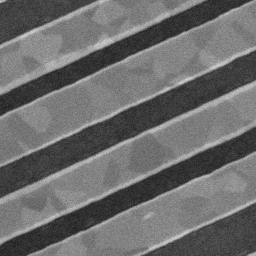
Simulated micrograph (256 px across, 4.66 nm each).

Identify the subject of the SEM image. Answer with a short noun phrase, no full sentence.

lines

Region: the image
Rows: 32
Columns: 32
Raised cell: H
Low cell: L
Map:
LLLLLLLLLLLHHHHHHHHHHHHHLLLLLLLH
LLLLLLLLLHHHHHHHHHHHHHLLLLLLHHHH
LLLLLLLHHHHHHHHHHHHHLLLLLLLHHHHH
LLLLLHHHHHHHHHHHHHLLLLLLHHHHHHHH
LLHHHHHHHHHHHHHHLLLLLLHHHHHHHHHH
HHHHHHHHHHHHHHLLLLLLHHHHHHHHHHHH
HHHHHHHHHHHLLLLLLHHHHHHHHHHHHHHL
HHHHHHHHHLLLLLLHHHHHHHHHHHHHHLLL
HHHHHHHLLLLLLHHHHHHHHHHHHHHLLLLL
HHHHHLLLLLLHHHHHHHHHHHHHHLLLLLLL
HHHLLLLLLHHHHHHHHHHHHHHLLLLLLLLH
HLLLLLLHHHHHHHHHHHHHHLLLLLLLLHHH
LLLLHHHHHHHHHHHHHHLLLLLLLLLHHHHH
LLHHHHHHHHHHHHHHLLLLLLLLLHHHHHHH
HHHHHHHHHHHHHHLLLLLLLLHHHHHHHHHH
HHHHHHHHHHHHLLLLLLLLHHHHHHHHHHHH
HHHHHHHHHHLLLLLLLLHHHHHHHHHHHHLL
HHHHHHHLLLLLLLLLHHHHHHHHHHHHLLLL
HHHHHLLLLLLLLLHHHHHHHHHHHHLLLLLL
HHHLLLLLLLLLHHHHHHHHHHHHLLLLLLLH
HLLLLLLLLHHHHHHHHHHHHHLLLLLLHHHH
LLLLLLLHHHHHHHHHHHHHLLLLLLLHHHHH
LLLLLHHHHHHHHHHHHHLLLLLLHHHHHHHH
LLLHHHHHHHHHHHHHLLLLLLHHHHHHHHHH
LHHHHHHHHHHHHLLLLLLLHHHHHHHHHHHH
HHHHHHHHHHHLLLLLLLHHHHHHHHHHHHHL
HHHHHHHHHLLLLLLLHHHHHHHHHHHHHLLL
HHHHHHHLLLLLLHHHHHHHHHHHHHHLLLLL
HHHHLLLLLLLHHHHHHHHHHHHHHLLLLLLL
HHLLLLLLLHHHHHHHHHHHHHHLLLLLLLLL
LLLLLLLHHHHHHHHHHHHHHLLLLLLLLLLL
LLLLLHHHHHHHHHHHHHHLLLLLLLLLLLLL